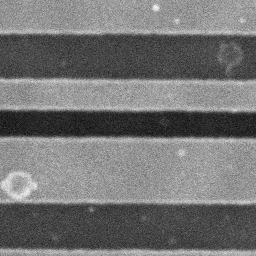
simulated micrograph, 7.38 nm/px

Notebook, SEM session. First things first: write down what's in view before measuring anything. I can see lines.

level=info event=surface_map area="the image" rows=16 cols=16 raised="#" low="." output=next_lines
################
################
................
................
................
################
################
................
................
################
################
################
################
................
................
................